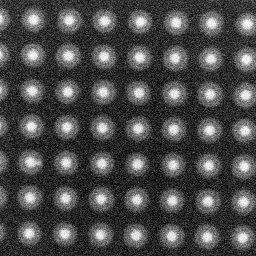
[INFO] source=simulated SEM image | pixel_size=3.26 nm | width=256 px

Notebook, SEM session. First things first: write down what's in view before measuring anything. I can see an array of small figures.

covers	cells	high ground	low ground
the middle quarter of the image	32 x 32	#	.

###.....####.....####....#####..
...........................##...
................................
................................
###.....###.......##............
###....#####....#####....#####..
####...######...#####....#####..
####...######...#####....######.
###....######...#####....#####..
##......###......####.....####..
................................
................................
................................
##......###......###............
###....#####....#####....#####..
####...#####....#####....#####..
####...#####....#####....#####..
###....#####....#####....#####..
##......###......###.....####...
................................
................................
................................
###.....###......##.......##....
###....#####....#####....#####..
###....#####....#####....#####..
###....#####....#####....#####..
###....#####....#####....#####..
#.......###......###.....####...
................................
................................
................................
##.....####......###......##....